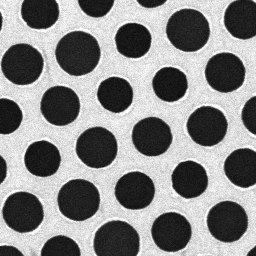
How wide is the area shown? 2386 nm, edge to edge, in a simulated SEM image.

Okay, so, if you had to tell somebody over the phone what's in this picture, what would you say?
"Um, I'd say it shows a regular array of holes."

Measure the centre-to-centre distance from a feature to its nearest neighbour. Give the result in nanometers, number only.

517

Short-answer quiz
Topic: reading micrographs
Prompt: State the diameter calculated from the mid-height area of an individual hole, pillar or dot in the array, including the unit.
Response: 369 nm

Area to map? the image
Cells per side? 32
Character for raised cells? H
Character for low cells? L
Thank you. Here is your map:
HHHLLLLHHHLLLLHHHHLLHHHHHHHHHLLL
HHHLLLLHHHLLLHHHHHHHHHLLLHHHLLLL
HHHLLLLHHHHHHHHHHHHHHLLLLLHHLLLL
HHHHLLHHHHHHHHHLLLHHHLLLLLHHLLLL
HHHHHHHHLLLLHHLLLLLHHLLLLLHHHLLL
HHLHHHHLLLLLHHLLLLLHHHLLLLHHHHHH
HLLLLHHLLLLLLHHLLLHHHHHHHHHHHHHH
LLLLLHHLLLLLHHHHHHHHHHHHHHLLLLHH
LLLLLHHHLLLLHHHHHHHHHLHHHHLLLLLH
HLLLLHHHHHHHHHHHHHHLLLLHHHLLLLLH
HHLLHHHHHHHHHLLLHHHLLLLHHHLLLLHH
HHHHHHLLLHHHLLLLLHHLLLLHHHHHHHHH
LHHHHLLLLLHHLLLLLHHHLLHHHHHHHHHL
LLHHHLLLLLHHHLLLHHHHHHHHHLLHHHLL
LLLHHLLLLLHHHHHHHHHHHHHHLLLLHHLL
LLLHHHHLHHHHHHHHHLLLLHHLLLLLHHHL
LLHHHHHHHHLLLLHHHLLLLHHHLLLLHHHL
HHHHHHHHHHLLLLHHHLLLLHHHLLLLHHHH
HHHHLLLHHHLLLLLHHLLLLHHHHHHHHHHH
HHHLLLLLHHLLLLHHHHHHHHHHHHHHHLLL
LHHLLLLHHHHLLLHHHHHHHHLLLHHHLLLL
LHHHLLLHHHHHHHHHHHHHHHLLLLHHLLLL
LHHHHHHHHLLHHHHLLLLHHLLLLLHHHLLL
HHHHHHHHLLLLHHLLLLLHHHLLLLHHHHHH
HLLLHHHLLLLLHHLLLLLHHHHLLHHHHHHH
HLLLLHHLLLLLHHHLLLLHHHHHHHHLLLHH
LLLLLHHHLLLLHHHHHHHHHHHHHHLLLLLH
HLLLLHHHHLHHHHHHHHHLLLLHHHLLLLLH
HLLLHHHHHHHHLLLLLHHLLLLLHHLLLLLH
HHHHHHHLHHHHLLLLLHHLLLLLHHHLLLHH
HHHHHHLLLLHHLLLLLHHHLLLHHHHHHHHH
LLLHHLLLLLHHLLLLLHHHHHHHHHHHHHHL